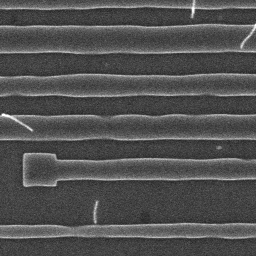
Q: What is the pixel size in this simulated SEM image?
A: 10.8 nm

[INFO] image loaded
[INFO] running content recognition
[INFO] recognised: groups of lines, slits or small figures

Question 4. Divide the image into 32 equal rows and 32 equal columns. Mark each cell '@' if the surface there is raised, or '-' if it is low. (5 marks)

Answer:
@@@@@@@@@@@@@@@@@@@@@@@@@@@@@@@@
--------------------------------
--------------------------------
@@@@@@@@@@@@@@@@@@@@@@@@@@@@@@@@
@@@@@@@@@@@@@@@@@@@@@@@@@@@@@@@@
@@@@@@@@@@@@@@@@@@@@@@@@@@@@@@@@
@@@@@---@@@@@@@@@@@@@@@---------
--------------------------------
--------------------------------
--------@@@@@@@--------@@@@@@@@@
@@@@@@@@@@@@@@@@@@@@@@@@@@@@@@@@
@@@@@@@@@@@@@@@@@@@@@@@@@@@@@@@@
--------------------------------
--------------------------------
@@------@@@@--@@@@--@@@@@@@@@@@@
@@@@@@@@@@@@@@@@@@@@@@@@@@@@@@@@
@@@@@@@@@@@@@@@@@@@@@@@@@@@@@@@@
--------------------------------
--------------------------------
---@@@@-------------------------
---@@@@@@@@@@@@@@@@@@@@@@@@@@@@@
---@@@@@@@@@@@@@@@@@@@@@@@@@@@@@
---@@@@@@----@@------@@---------
--------------------------------
--------------------------------
--------------------------------
--------------------------------
--------------------------------
@@@@@@@@@@@@@@@@@@@@@@@@@@@@@@@@
@@@@@@@@--@@-@@@@@@@@@@@@@@@@@@@
--------------------------------
--------------------------------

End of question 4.